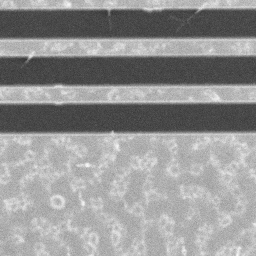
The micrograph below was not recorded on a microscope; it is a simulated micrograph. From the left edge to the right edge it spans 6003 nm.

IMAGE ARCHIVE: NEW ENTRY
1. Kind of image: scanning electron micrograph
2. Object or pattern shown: parallel lines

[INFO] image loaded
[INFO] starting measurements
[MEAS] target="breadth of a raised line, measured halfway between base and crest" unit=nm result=404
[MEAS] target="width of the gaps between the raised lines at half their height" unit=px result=30.8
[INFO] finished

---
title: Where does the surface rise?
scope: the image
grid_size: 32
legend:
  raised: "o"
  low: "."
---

oooooooooooooooooooooooooooooooo
................................
................................
................................
................................
oooooooooooooooooooooooooooooooo
oooooooooooooooooooooooooooooooo
................................
................................
................................
................................
oooooooooooooooooooooooooooooooo
oooooooooooooooooooooooooooooooo
................................
................................
................................
................................
oooooooooooooooooooooooooooooooo
oooooooooooooooooooooooooooooooo
oooooooooooooooooooooooooooooooo
oooooooooooooooooooooooooooooooo
oooooooooooooooooooooooooooooooo
oooooooooooooooooooooooooooooooo
oooooooooooooooooooooooooooooooo
oooooooooooooooooooooooooooooooo
oooooooooooooooooooooooooooooooo
oooooooooooooooooooooooooooooooo
oooooooooooooooooooooooooooooooo
oooooooooooooooooooooooooooooooo
oooooooooooooooooooooooooooooooo
oooooooooooooooooooooooooooooooo
oooooooooooooooooooooooooooooooo